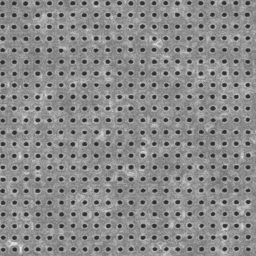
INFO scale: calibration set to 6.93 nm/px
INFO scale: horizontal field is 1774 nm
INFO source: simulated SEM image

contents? a regular array of holes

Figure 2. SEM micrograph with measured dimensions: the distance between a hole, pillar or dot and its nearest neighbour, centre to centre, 0.0789 um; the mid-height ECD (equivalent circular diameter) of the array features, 4.65 pixels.